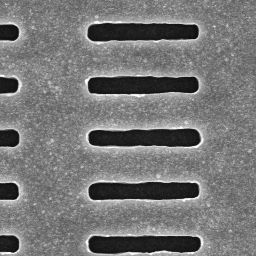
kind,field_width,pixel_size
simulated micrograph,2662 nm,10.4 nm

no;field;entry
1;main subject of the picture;holes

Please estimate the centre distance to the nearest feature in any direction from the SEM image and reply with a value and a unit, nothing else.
550 nanometers